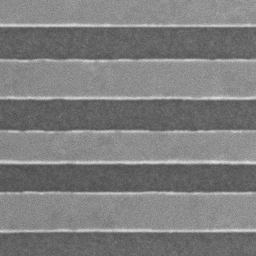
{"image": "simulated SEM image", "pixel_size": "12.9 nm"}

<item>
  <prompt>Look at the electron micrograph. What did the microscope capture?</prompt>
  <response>lines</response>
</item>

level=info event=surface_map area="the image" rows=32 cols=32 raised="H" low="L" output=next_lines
HHHHHHHHHHHHHHHHHHHHHHHHHHHHHHHH
HHHHHHHHHHHHHHHHHHHHHHHHHHHHHHHH
HHHHHHHHHHHHHHHHHHHHHHHHHHHHHHHH
LLLLLLLLLLLLLLLLLLLLLLLLLLLLLLLL
LLLLLLLLLLLLLLLLLLLLLLLLLLLLLLLL
LLLLLLLLLLLLLLLLLLLLLLLLLLLLLLLL
LLLLLLLLLLLLLLLLLLLLLLLLLLLLLLLL
HHLLHHHLHHLLLLHHHHHHHHHHHHLHLHHL
HHHHHHHHHHHHHHHHHHHHHHHHHHHHHHHH
HHHHHHHHHHHHHHHHHHHHHHHHHHHHHHHH
HHHHHHHHHHHHHHHHHHHHHHHHHHHHHHHH
HHHHHHHHHHHHHHHHHHHHHHHHHHHHHHHH
LLLLLLLLLLLLLLLLLLLLLLLLLLLLLLLL
LLLLLLLLLLLLLLLLLLLLLLLLLLLLLLLL
LLLLLLLLLLLLLLLLLLLLLLLLLLLLLLLL
LLLLLLLLLLLLLLLLLLLLLLLLLLLLLLLL
HHHHHHHHHHHHHHHHHHHHHHHHHHHHHHHH
HHHHHHHHHHHHHHHHHHHHHHHHHHHHHHHH
HHHHHHHHHHHHHHHHHHHHHHHHHHHHHHHH
HHHHHHHHHHHHHHHHHHHHHHHHHHHHHHHH
LLLLLLLLLLLLLLLLLLLLLLLLLLLLLLLL
LLLLLLLLLLLLLLLLLLLLLLLLLLLLLLLL
LLLLLLLLLLLLLLLLLLLLLLLLLLLLLLLL
LLLLLLLLLLLLLLLLLLLLLLLLLLLLLLLL
HHHHHHHHHHHHHHHHHHHHHHHHHHHHHHHH
HHHHHHHHHHHHHHHHHHHHHHHHHHHHHHHH
HHHHHHHHHHHHHHHHHHHHHHHHHHHHHHHH
HHHHHHHHHHHHHHHHHHHHHHHHHHHHHHHH
HHHHHHHHHHHHHHHHHHHHHHHHHHHHHHHH
LLLLLLLLLLLLLLLLLLLLLLLLLLLLLLLL
LLLLLLLLLLLLLLLLLLLLLLLLLLLLLLLL
LLLLLLLLLLLLLLLLLLLLLLLLLLLLLLLL